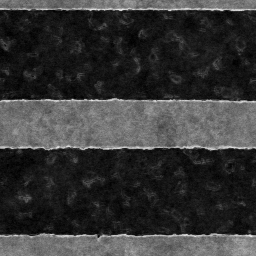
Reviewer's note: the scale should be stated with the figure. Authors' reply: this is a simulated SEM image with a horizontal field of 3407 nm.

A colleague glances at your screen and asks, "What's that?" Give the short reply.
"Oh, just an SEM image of one or a few lines or trenches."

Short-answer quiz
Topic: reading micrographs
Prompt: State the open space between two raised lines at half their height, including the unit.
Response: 1.18 microns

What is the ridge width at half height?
626 nm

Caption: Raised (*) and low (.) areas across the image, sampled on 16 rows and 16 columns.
****************
................
................
................
................
................
****************
****************
****************
................
................
................
................
................
................
****************